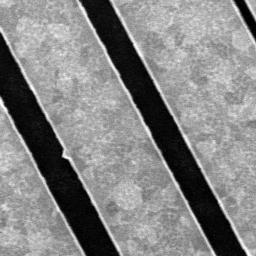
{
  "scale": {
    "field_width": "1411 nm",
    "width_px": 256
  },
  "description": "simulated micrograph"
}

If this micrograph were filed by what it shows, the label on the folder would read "one or a few lines or trenches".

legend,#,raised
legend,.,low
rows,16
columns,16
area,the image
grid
#####..########.
######..#######.
######..########
.######..#######
.######..#######
..######..######
...#####..######
#..######..#####
#...#####...####
##..######..####
##...#####...###
###..######..###
###...######..##
####..######..##
####...######..#
#####..######..#